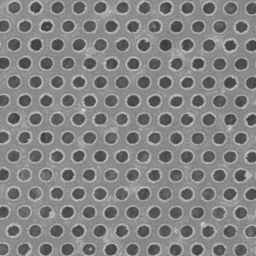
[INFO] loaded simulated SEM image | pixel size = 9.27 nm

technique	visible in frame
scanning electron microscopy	a regular array of holes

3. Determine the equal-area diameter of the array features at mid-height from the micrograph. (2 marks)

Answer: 0.118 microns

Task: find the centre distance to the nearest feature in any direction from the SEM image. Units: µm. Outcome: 0.196